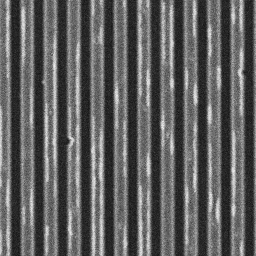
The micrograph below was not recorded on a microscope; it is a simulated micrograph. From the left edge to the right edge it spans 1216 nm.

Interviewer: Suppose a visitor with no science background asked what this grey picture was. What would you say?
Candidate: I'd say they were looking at parallel lines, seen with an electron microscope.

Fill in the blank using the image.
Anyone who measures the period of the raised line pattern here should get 111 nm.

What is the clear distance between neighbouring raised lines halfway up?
51 nm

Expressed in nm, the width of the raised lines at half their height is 60.5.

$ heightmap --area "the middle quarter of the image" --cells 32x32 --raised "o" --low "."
.ooo...ooo...ooo..ooo...ooo...oo
.ooo...ooo...ooo..ooo...ooo...oo
.ooo...ooo...ooo..ooo...ooo...oo
.ooo...ooo...ooo..ooo...ooo...oo
.ooo...ooo...ooo..ooo...ooo...oo
.ooo...ooo...ooo..ooo...ooo...oo
.ooo...ooo...ooo..ooo...ooo...oo
.ooo...ooo...ooo..ooo...ooo...oo
.ooo...ooo...ooo..ooo...ooo...oo
.ooo...ooo...ooo..ooo...ooo...oo
.ooo...ooo...ooo..ooo...ooo...oo
.ooo...ooo...ooo..ooo...ooo...oo
.ooo...ooo...ooo..ooo...ooo...oo
.ooo...ooo...ooo..ooo...ooo...oo
.ooo...ooo...ooo..ooo...ooo...oo
.ooo...ooo...ooo..ooo...ooo...oo
.ooo...ooo...ooo..ooo...ooo...oo
.ooo...ooo...ooo..ooo...ooo...oo
.ooo...ooo...ooo..ooo...ooo...oo
..oo...ooo...ooo..ooo...ooo...oo
.ooo...ooo...ooo..ooo...ooo...oo
.ooo...ooo...ooo..ooo...ooo...oo
.ooo...ooo...ooo...oo...ooo...oo
.ooo...ooo...ooo...oo...ooo...oo
.ooo...ooo...ooo...oo...ooo...oo
.ooo...ooo...ooo...oo...ooo...oo
.ooo...ooo...ooo...oo...ooo...oo
.ooo...ooo...ooo...oo...ooo...oo
.ooo...ooo...ooo...oo...ooo...oo
.ooo...ooo...ooo...oo...ooo...oo
.ooo...ooo...ooo...oo...ooo...oo
.ooo...ooo...ooo...oo...ooo...oo